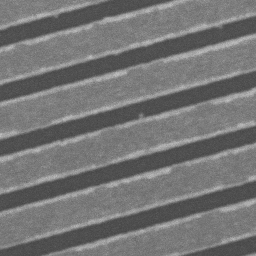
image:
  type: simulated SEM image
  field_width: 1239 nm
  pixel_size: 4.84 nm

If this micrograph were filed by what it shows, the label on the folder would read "parallel lines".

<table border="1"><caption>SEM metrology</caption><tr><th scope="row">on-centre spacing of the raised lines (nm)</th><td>256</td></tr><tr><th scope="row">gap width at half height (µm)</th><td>0.0899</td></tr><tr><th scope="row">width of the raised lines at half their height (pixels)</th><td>34.6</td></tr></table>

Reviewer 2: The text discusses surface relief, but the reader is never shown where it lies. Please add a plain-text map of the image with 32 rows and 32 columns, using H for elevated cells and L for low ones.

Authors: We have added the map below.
HHHHHHHHHHHLLLLLLLLLLHHHHHHHHHHH
HHHHHHHHLLLLLLLLLHHHHHHHHHHHHHHH
HHHHLLLLLLLLLHHHHHHHHHHHHHHHHHLL
LLLLLLLLLLHHHHHHHHHHHHHHHHLLLLLL
LLLLLLHHHHHHHHHHHHHHHHLLLLLLLLLH
LLHHHHHHHHHHHHHHHHHLLLLLLLLHHHHH
HHHHHHHHHHHHHHHLLLLLLLLLHHHHHHHH
HHHHHHHHHHHLLLLLLLLLHHHHHHHHHHHH
HHHHHHHLLLLLLLLLHHHHHHHHHHHHHHHH
HHHLLLLLLLLLLHHHHHHHHHHHHHHHHLLL
LLLLLLLLLHHHHHHHHHHHHHHHHLLLLLLL
LLLLLHHHHHHHHHHHHHHHHHLLLLLLLLLH
LHHHHHHHHHHHHHHHHHLLLLLLLLLHHHHH
HHHHHHHHHHHHHHLLLLLLLLLHHHHHHHHH
HHHHHHHHHHLLLLLLLLLLHHHHHHHHHHHH
HHHHHHHLLLLLLLLLHHHHHHHHHHHHHHHH
HHHLLLLLLLLLHHHHHHHHHHHHHHHHLLLL
LLLLLLLLHHHHHHHHHHHHHHHHHLLLLLLL
LLLLLHHHHHHHHHHHHHHHHLLLLLLLLLHH
LHHHHHHHHHHHHHHHHLLLLLLLLLLHHHHH
HHHHHHHHHHHHHHLLLLLLLLLHHHHHHHHH
HHHHHHHHHHLLLLLLLLLHHHHHHHHHHHHH
HHHHHHLLLLLLLLLHHHHHHHHHHHHHHHHH
HHHLLLLLLLLHHHHHHHHHHHHHHHHHLLLL
LLLLLLLLHHHHHHHHHHHHHHHHHLLLLLLL
LLLLHHHHHHHHHHHHHHHHHLLLLLLLLLHH
HHHHHHHHHHHHHHHHHLLLLLLLLLHHHHHH
HHHHHHHHHHHHHLLLLLLLLLHHHHHHHHHH
HHHHHHHHHLLLLLLLLLLHHHHHHHHHHHHH
HHHHHHLLLLLLLLLHHHHHHHHHHHHHHHHL
HHLLLLLLLLLHHHHHHHHHHHHHHHHHLLLL
LLLLLLLLHHHHHHHHHHHHHHHHLLLLLLLL